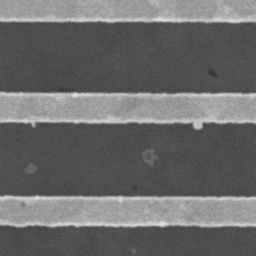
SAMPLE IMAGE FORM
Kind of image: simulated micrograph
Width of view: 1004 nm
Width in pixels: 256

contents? lines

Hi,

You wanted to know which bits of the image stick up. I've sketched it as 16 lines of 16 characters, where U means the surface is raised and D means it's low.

UUUUUUUUUUUUUUUU
DDDDDDDDDDDDDDDD
DDDDDDDDDDDDDDDD
DDDDDDDDDDDDDDDD
DDDDDDDDDDDDDDDD
DDDDDDDDDDDDDDDD
UUUUUUUUUUUUUUUU
UUUUUUUUUUUUUUUU
DDDDDDDDDDDDDDDD
DDDDDDDDDDDDDDDD
DDDDDDDDDDDDDDDD
DDDDDDDDDDDDDDDD
UUUUUUUUUUUUUUUU
UUUUUUUUUUUUUUUU
DDDDDDDDDDDDDDDD
DDDDDDDDDDDDDDDD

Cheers